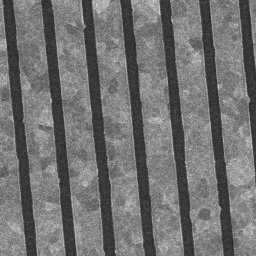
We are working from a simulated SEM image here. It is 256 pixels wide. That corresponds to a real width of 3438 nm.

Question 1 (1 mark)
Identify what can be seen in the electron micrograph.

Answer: parallel lines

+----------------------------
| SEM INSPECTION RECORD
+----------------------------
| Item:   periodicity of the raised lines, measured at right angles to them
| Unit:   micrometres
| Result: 0.526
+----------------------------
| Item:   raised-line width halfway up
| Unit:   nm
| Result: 368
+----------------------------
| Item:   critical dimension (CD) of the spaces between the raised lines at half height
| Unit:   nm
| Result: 152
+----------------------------